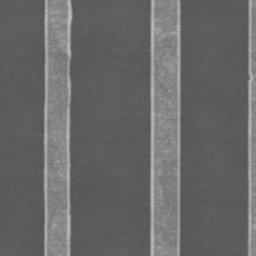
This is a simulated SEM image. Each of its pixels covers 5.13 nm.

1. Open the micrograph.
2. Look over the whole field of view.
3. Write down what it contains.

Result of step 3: one or a few lines or trenches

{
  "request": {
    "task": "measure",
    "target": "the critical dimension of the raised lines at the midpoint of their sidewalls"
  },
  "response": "26 px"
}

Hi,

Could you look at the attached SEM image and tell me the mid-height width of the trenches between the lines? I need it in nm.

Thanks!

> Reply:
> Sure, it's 390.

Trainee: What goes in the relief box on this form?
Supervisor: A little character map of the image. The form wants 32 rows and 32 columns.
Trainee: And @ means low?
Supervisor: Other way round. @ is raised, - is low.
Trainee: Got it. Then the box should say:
------@@@----------@@@---------@
------@@@----------@@@---------@
------@@@----------@@@---------@
------@@@----------@@@---------@
------@@@----------@@@---------@
------@@@----------@@@---------@
------@@@----------@@@---------@
------@@@----------@@@---------@
------@@@----------@@@---------@
------@@@----------@@@---------@
------@@@----------@@@---------@
------@@@----------@@@---------@
------@@@----------@@@---------@
------@@@----------@@@---------@
------@@@----------@@@---------@
------@@@----------@@@---------@
------@@@----------@@@---------@
------@@@----------@@@---------@
------@@@----------@@@---------@
------@@@----------@@@---------@
------@@@----------@@@---------@
------@@@----------@@@---------@
------@@@----------@@@---------@
------@@@----------@@@---------@
------@@@----------@@@---------@
------@@@----------@@@---------@
------@@@----------@@@---------@
------@@@----------@@@---------@
------@@@----------@@@---------@
------@@@----------@@@---------@
------@@@----------@@@---------@
------@@@----------@@@---------@